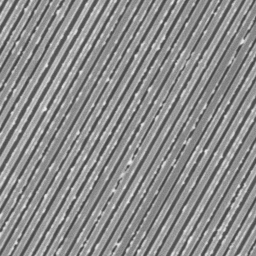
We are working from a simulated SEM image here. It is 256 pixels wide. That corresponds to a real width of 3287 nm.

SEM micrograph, parallel lines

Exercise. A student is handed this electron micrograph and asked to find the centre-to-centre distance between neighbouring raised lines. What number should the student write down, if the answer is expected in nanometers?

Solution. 126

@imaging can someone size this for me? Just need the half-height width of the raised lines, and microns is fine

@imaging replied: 0.0798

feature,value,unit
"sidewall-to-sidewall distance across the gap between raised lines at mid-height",50.4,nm